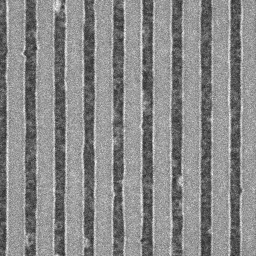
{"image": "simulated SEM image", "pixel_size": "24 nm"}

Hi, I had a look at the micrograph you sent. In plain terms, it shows parallel lines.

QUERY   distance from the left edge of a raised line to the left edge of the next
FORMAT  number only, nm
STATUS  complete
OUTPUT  701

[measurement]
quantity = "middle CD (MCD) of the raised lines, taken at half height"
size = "302 nm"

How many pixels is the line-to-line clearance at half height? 17.1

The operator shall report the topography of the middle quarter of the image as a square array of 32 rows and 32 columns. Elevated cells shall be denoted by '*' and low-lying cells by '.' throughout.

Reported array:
.....***....***.....**.....***..
.....***....***.....**.....***..
.....***....***.....**.....***..
.....***....***.....**.....***..
.....***....***.....**.....***..
.....***....***.....**.....***..
.....***....***.....**.....***..
.....***....***.....**.....***..
*....***....***.....**.....***..
*....***....***.....**.....***..
*....***....***.....**.....***..
*....***....***.....**.....***..
*....***....***.....**.....***..
*....***....***.....**.....***..
*....***....***.....**.....***..
*....***....***....***.....***..
*....***....***....***.....***..
.....***....***.....**.....***..
.....***....***.....**.....***..
*....***....***.....**.....***..
*....***....***.....**.....***..
.....***....***.....**.....***..
*....***....***.....**.....***..
*....***....***.....**.....***..
*....***....***.....**.....**...
.....***....***.....**.....**...
.....***....***.....**.....***..
*....***....***.....**.....***..
*....***....***....***.....***..
*....***....***....***.....***..
.....***....***.....**.....***..
.....***....***.....**.....***..